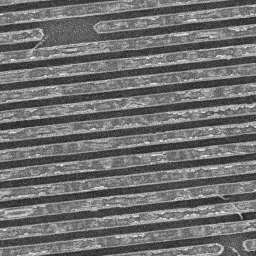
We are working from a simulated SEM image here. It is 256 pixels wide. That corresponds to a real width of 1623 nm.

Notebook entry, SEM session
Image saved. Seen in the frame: parallel lines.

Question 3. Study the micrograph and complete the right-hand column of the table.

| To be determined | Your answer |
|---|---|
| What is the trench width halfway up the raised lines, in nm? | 49.6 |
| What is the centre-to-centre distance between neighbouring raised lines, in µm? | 0.123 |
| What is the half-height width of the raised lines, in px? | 10.8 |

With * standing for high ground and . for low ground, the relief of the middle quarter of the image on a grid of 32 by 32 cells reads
**********************..........
*************...................
****.....................*******
.................***************
........**********************..
*********************...........
************....................
***......................*******
................****************
.......***********************..
*********************...........
************...................*
***...................**********
.............*******************
....***********************.*...
******************..............
*********.*...................**
*......................*********
.............*******************
....**********************.**...
*****************...............
**********....................**
.....................***********
............********************
...***********************......
*****************...............
********.....................***
....................************
...........*********************
..***********************.......
****************................
*******......................***